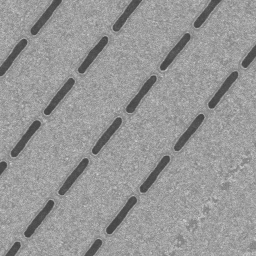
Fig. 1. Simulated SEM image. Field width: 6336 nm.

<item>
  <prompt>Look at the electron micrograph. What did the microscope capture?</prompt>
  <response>a regular array of holes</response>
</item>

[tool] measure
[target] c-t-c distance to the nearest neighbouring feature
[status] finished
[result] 1.32 micrometres